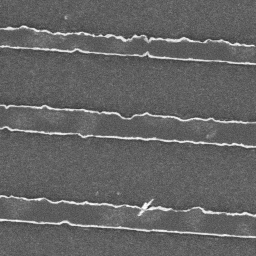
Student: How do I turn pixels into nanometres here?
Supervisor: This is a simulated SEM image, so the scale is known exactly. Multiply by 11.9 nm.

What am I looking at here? one or a few lines or trenches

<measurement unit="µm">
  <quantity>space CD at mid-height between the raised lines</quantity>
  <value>0.755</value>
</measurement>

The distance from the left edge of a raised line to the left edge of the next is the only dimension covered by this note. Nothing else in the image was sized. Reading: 1020 nm